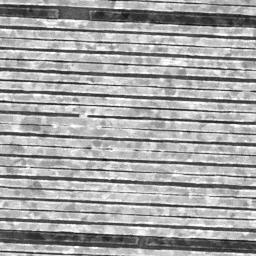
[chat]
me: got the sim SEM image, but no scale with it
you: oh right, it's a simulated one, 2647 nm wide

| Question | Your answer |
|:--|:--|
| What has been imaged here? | parallel lines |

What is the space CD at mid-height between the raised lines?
37.4 nm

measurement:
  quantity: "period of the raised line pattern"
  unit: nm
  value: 110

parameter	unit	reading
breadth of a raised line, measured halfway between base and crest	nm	82.6